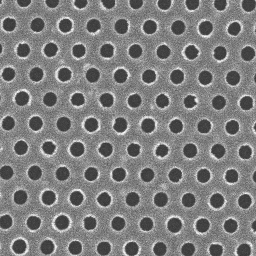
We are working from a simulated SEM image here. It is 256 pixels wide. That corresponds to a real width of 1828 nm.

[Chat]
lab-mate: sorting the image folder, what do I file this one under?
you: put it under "a regular array of holes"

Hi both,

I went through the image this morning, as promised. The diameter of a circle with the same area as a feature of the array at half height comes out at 13.8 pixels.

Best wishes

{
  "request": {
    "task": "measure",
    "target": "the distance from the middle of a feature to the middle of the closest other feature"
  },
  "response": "199 nanometres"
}